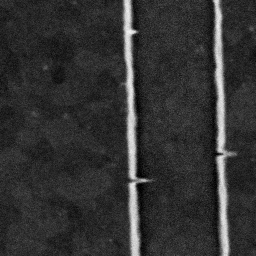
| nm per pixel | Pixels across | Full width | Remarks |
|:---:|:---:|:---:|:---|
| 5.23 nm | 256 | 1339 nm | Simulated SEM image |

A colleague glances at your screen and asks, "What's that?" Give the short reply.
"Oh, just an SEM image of one or a few lines or trenches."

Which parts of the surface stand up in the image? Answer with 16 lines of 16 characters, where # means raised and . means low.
########......##
########......##
########......##
########......##
########......##
########......##
########......##
########......##
########......##
########......##
########......##
########......##
########......##
########......##
########......##
########......##